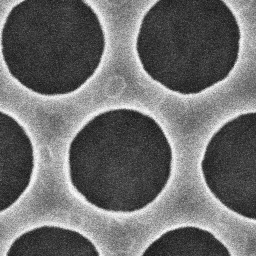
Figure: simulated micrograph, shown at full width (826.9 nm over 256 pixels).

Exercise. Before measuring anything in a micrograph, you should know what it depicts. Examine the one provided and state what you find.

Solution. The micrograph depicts holes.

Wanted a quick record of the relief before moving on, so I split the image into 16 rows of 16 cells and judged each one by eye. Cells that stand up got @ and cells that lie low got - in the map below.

@-----@@@-----@@
------@@@------@
-------@@------@
------@@@------@
@-----@@@-----@@
@@---@@@@@---@@@
@@@@@@@@@@@@@@@@
-@@@@@----@@@@--
--@@@-----@@@---
--@@-------@@---
--@@-------@@---
--@@@-----@@@---
-@@@@-----@@@@--
@@@@@@@@@@@@@@@-
@@---@@@@@@--@@@
@-----@@@-----@@